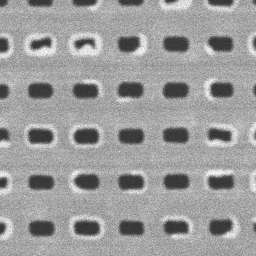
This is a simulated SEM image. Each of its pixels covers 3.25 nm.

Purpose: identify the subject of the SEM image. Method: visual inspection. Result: a regular array of holes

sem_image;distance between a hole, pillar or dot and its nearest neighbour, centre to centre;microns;0.146